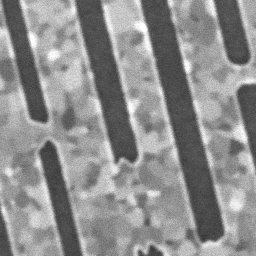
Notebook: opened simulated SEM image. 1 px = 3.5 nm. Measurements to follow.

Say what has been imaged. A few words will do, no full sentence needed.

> one or a few lines or trenches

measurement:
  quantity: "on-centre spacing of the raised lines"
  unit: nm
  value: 244